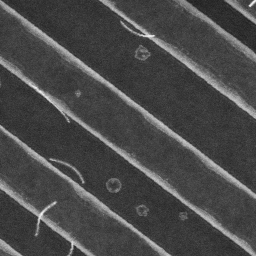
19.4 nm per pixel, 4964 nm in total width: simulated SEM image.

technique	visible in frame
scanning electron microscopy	lines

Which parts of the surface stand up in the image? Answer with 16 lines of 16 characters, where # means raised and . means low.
#......#####...#
##......#####...
###.......#####.
#####......#####
.#####......####
..#####.......##
...######......#
.....#####......
#.....#####.....
##.....#####....
###......#####..
#####.....#####.
.#####.....#####
..#####......###
....#####.....##
#....#####.....#